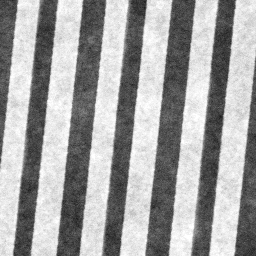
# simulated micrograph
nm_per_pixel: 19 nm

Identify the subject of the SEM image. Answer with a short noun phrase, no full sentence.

lines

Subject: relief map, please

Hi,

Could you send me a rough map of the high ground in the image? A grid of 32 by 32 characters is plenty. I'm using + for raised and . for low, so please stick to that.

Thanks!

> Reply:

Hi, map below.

..+++..+++...+++..+++....++...++
..+++..+++...+++..+++...+++..+++
..+++..+++...+++..+++...+++..+++
..+++..+++...+++..+++...+++..+++
..++...+++...+++..+++...+++..+++
..++...+++...++...+++...+++..+++
..++...+++...++...+++...++...+++
..++...++....++...+++...++...+++
.+++..+++...+++...+++...++...+++
.+++..+++...+++..++++...++...+++
.+++..+++...+++..+++...+++..++++
.+++..+++...+++..+++...+++..+++.
.+++..+++...+++..+++...+++..+++.
.+++..+++...+++..+++...+++..+++.
.++...+++...++...+++...+++..+++.
.++...+++...++...+++...+++..+++.
.++...+++...++...+++...++...+++.
+++...+++..+++...+++...++...+++.
+++..+++...+++...+++...++...+++.
+++..+++...+++..+++....++...+++.
+++..+++...+++..+++...+++..+++..
+++..+++...+++..+++...+++..+++..
+++..+++...+++..+++...+++..+++..
++...+++...+++..+++...+++..+++..
++...+++...++...+++...+++..+++..
++...+++...++...+++...+++..+++..
++..++++...++...+++...+++..+++..
++..++++..+++..++++...++...+++..
++..+++...+++..++++...++...+++..
++..+++...+++..+++...+++...+++..
++..+++...+++..+++...+++..+++...
++..+++...+++..+++...+++..+++...